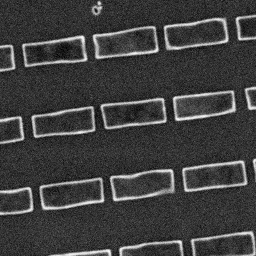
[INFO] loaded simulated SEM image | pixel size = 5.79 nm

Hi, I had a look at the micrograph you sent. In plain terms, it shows an array of small figures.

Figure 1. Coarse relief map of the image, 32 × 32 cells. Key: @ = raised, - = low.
--------------------------------
--------------------------------
--------------------------@@--@@
-----------------@@--@@@@@@@--@@
------------@@@@@@@@-@@@@@@@--@@
----@@@@@@--@@@@@@@@-@@@@@@-----
@@-@@@@@@@@-@@@@@@@-------------
@@-@@@@@@@@---------------------
@-------------------------------
--------------------------------
--------------------------------
---------------------------@@--@
-------------------@--@@@@@@@--@
-------------@@@@@@@@-@@@@@@@--@
----@@@@@@@@-@@@@@@@@-@@@@------
@@@-@@@@@@@@-@@@@@@-------------
@@@-@@@@@@@---------------------
@@@-----------------------------
--------------------------------
--------------------------------
---------------------------@@@--
------------------@@@--@@@@@@@@-
-----------@@-@@@@@@@@-@@@@@@@@-
-----@@@@@@@@-@@@@@@@@-@@@@-----
@@@@-@@@@@@@@-@@@@@-------------
@@@@-@@@@@----------------------
@@@-----------------------------
--------------------------------
--------------------------------
----------------------------@@@@
------------------@@@@@-@@@@@@@@
-----------@@@-@@@@@@@@-@@@@@@@@